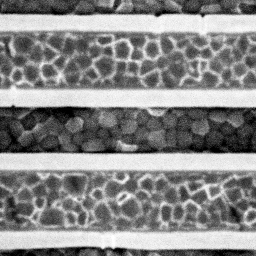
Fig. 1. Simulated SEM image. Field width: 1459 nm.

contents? one or a few lines or trenches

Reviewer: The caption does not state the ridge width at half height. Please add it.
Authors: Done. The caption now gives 432 nm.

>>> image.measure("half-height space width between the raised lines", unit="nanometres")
370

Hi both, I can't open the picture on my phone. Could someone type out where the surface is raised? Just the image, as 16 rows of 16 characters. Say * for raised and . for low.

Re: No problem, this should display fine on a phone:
................
..*******..*....
****************
****************
****************
****************
................
................
................
................
****************
****************
****************
****************
****************
................